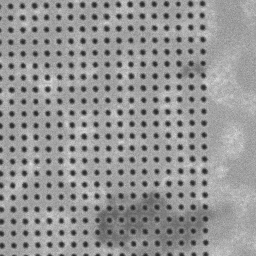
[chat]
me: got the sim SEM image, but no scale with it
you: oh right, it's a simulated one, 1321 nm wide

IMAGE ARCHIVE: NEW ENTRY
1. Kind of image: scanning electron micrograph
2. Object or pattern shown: a regular array of holes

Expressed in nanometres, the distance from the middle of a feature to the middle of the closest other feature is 60.5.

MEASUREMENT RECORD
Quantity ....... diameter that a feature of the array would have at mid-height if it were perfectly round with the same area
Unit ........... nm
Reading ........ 28.5